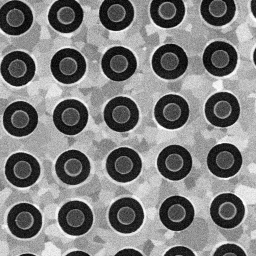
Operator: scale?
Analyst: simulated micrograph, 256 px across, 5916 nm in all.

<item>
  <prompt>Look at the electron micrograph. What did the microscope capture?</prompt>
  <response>an array of small figures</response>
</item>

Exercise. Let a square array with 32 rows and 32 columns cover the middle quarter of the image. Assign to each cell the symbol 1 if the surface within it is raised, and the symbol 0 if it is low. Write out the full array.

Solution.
11100011100011110011110001110001
11100011100011100011110000000001
11000111110000000111111000000011
00000111111000001111111100000111
00001111111110111111111111111111
11111111111111111111111111111111
11111111111111111111111111111111
11111111111111111111111111000111
10011111111100000111111100000011
00000111111000000011111000000001
00000011110000100001111000110001
11100011110011110001110001111000
11110011100011110001110001111001
11110011110011110001110001110001
11100011110001100001111000000001
00000111111000000011111100000011
00000111111100000111111111001111
00011111111111111111111111111111
11111111111111111111111111111111
11111111111111111111111111111111
11111111111111111111111111000111
10011111111100000011111110000001
00000111111000000001111100000000
00000011110000110001111000111000
01110001110001111000111001111100
11110001110001111000111000111000
11110001110001111000111000011000
00100001111000000001111100000001
00000011111000000011111110000011
00000111111110000111111111111111
00011111111111111111111111111111
11111111111111111111111111111111